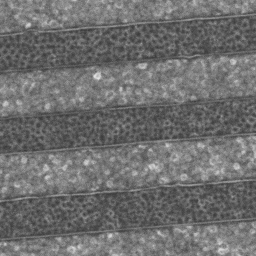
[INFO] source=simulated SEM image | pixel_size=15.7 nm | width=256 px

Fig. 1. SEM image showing one or a few lines or trenches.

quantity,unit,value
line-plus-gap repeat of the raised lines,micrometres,1.31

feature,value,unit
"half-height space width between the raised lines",726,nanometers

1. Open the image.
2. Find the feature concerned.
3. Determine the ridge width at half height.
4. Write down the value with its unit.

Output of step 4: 0.574 µm